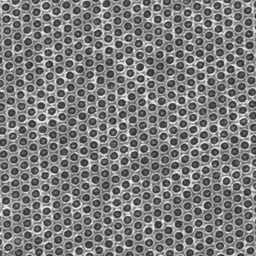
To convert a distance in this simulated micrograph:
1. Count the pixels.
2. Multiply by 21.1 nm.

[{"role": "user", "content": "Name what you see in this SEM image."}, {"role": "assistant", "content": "a regular array of holes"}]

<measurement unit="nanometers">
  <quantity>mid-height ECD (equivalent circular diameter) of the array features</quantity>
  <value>183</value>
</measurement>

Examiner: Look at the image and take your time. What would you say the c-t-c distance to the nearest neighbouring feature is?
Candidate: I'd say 0.241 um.